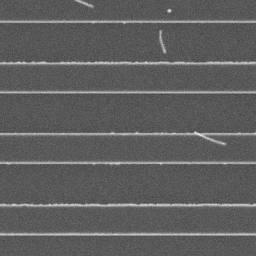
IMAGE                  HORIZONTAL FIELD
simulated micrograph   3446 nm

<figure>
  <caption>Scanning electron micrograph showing lines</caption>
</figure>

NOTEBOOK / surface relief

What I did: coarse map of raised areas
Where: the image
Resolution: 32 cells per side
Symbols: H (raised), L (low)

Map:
HHHHHHHHHHHHHHHHHHHHHHHHHHHHHHHH
HHHHHHHHHHHHHHHHHHHHHHHHHHHHHHHH
HHHHHHHHHHHHHHHHHHHHHHHHHHHHHHHH
LLLLLLLLLLLLLLLLLLLLLLLLLLLLLLLL
LLLLLLLLLLLLLLLLLLLLLLLLLLLLLLLL
LLLLLLLLLLLLLLLLLLLLLLLLLLLLLLLL
LLLLLLLLLLLLLLLLLLLLLLLLLLLLLLLL
LLLLLLLLLLLLLLLLLLLLLLLLLLLLLLLL
HHHHHHHHHHHHHHHHHHHHHHHHHHHHHHHH
HHHHHHHHHHHHHHHHHHHHHHHHHHHHHHHH
HHHHHHHHHHHHHHHHHHHHHHHHHHHHHHHH
HHHHHHHHHHHHHHHHHHHHHHHHHHHHHHHH
LLLLLLLLLLLLLLLLLLLLLLLLLLLLLLLL
LLLLLLLLLLLLLLLLLLLLLLLLLLLLLLLL
LLLLLLLLLLLLLLLLLLLLLLLLLLLLLLLL
LLLLLLLLLLLLLLLLLLLLLLLLLLLLLLLL
LLLLLLLLLLLLLLLLLLLLLLLLLLLLLLLL
HHHHHHHHHHHHHHHHHHHHHHHHHHHHHHHH
HHHHHHHHHHHHHHHHHHHHHHHHHHHHHHHH
HHHHHHHHHHHHHHHHHHHHHHHHHHHHHHHH
LLLLLLLLLLLLLLLLLLLLLLLLLLLLLLLL
LLLLLLLLLLLLLLLLLLLLLLLLLLLLLLLL
LLLLLLLLLLLLLLLLLLLLLLLLLLLLLLLL
LLLLLLLLLLLLLLLLLLLLLLLLLLLLLLLL
LLLLLLLLLLLLLLLLLLLLLLLLLLLLLLLL
LLLLLLLLLLLLLLLLLLLLLLLLLLLLLLLL
HHHHHHHHHHHHHHHHHHHHHHHHHHHHHHHH
HHHHHHHHHHHHHHHHHHHHHHHHHHHHHHHH
HHHHHHHHHHHHHHHHHHHHHHHHHHHHHHHH
LLLLLLLLLLLLLLLLLLLLLLLLLLLLLLLL
LLLLLLLLLLLLLLLLLLLLLLLLLLLLLLLL
LLLLLLLLLLLLLLLLLLLLLLLLLLLLLLLL